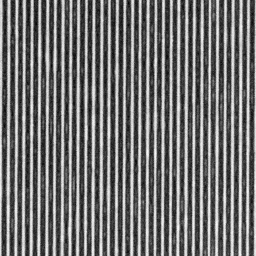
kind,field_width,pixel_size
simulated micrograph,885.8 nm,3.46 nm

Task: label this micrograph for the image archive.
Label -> parallel lines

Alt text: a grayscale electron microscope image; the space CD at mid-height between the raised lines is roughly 19.1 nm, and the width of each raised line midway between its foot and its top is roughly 0.0087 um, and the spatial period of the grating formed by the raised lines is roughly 26.8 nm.